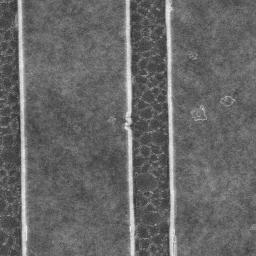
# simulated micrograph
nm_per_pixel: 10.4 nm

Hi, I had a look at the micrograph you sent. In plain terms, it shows one or a few lines or trenches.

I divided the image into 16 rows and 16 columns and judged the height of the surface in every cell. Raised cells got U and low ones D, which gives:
DUUUUUUUDDUUUUUU
DUUUUUUUDDDUUUUU
DUUUUUUUDDDUUUUU
DUUUUUUUDDDUUUUU
DUUUUUUUDDDUUUUU
DUUUUUUUDDDUUUUU
DUUUUUUUDDDUUUUU
DUUUUUUUDDDUUUUU
DUUUUUUUDDDUUUUU
DUUUUUUUDDDUUUUU
DUUUUUUUDDDUUUUU
DUUUUUUUDDDUUUUU
DUUUUUUUDDDUUUUU
DUUUUUUUDDDUUUUU
DDUUUUUUDDDUUUUU
DDUUUUUUDDDUUUUU